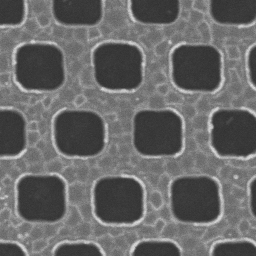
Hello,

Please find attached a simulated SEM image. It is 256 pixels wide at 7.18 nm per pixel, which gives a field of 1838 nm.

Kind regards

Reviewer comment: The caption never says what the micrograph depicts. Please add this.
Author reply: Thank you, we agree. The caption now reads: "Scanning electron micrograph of a regular array of holes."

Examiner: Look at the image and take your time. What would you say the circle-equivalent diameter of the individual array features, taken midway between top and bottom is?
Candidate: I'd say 363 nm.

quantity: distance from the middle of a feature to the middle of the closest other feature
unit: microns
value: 0.548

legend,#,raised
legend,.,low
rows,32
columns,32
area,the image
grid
...####......###......####......
...####......###......####......
...####.....#####.....#####.....
################################
################################
#############...################
##......####......####.....####.
##......####......####......###.
##......####......####......###.
##......####......####......###.
###.....####.....#####.....#####
################################
################################
################################
...####.....#####.....#####.....
...####......####......###......
...####......####......###......
...####......####......####.....
...####......####......####.....
#########..#################...#
################################
################################
###.....####.....#####.....#####
##......####......###......####.
##......####......###......####.
##......####......###......####.
##......####......####.....#####
###....######....#####.....#####
################################
################################
..######.#.######.....#####.....
...####......####.....#####.....